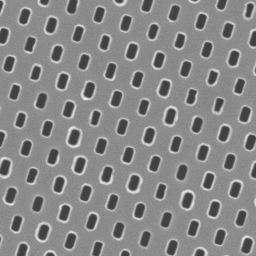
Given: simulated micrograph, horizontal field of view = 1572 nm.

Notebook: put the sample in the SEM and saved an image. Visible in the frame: a regular array of holes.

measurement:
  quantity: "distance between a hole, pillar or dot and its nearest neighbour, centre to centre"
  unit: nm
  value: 172